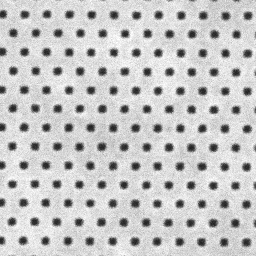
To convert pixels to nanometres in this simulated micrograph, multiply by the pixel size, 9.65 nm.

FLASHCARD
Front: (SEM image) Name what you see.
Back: a regular array of holes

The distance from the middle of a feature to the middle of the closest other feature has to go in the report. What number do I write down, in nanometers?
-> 209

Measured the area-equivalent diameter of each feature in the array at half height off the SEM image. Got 94.9 nm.